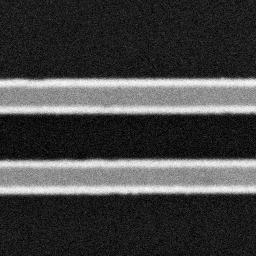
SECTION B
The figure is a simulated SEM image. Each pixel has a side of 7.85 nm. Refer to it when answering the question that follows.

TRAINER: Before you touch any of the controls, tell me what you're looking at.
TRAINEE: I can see lines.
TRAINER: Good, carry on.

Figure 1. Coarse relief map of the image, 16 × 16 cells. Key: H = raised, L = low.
LLLLLLLLLLLLLLLL
LLLLLLLLLLLLLLLL
LLLLLLLLLLLLLLLL
LLLLLLLLLLLLLLLL
LLLLLLLLLLLLLLLL
HHHHHHHHHHHHHHHH
HHHHHHHHHHHHHHHH
LLLLLLLLLLLLLLLL
LLLLLLLLLLLLLLLL
LLLLLLLLLLLLLLLL
HHHHHHHHHHHHHHHH
HHHHHHHHHHHHHHHH
LLLLLLLLLLLLLLLL
LLLLLLLLLLLLLLLL
LLLLLLLLLLLLLLLL
LLLLLLLLLLLLLLLL